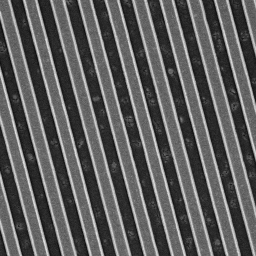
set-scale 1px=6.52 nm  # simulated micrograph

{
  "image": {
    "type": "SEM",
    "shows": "parallel lines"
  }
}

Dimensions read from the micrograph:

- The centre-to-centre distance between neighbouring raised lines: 26.4 pixels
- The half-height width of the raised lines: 0.0843 micrometres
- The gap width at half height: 89.9 nanometres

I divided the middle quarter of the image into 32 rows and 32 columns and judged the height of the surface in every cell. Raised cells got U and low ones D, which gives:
DUUUDDDDUUUDDDDUUUDDDUUUUDDDUUUU
DUUUUDDDUUUDDDDUUUDDDDUUUDDDDUUU
DUUUUDDDUUUUDDDUUUUDDDUUUDDDDUUU
DDUUUDDDDUUUDDDDUUUDDDUUUDDDDUUU
DDUUUDDDDUUUDDDDUUUDDDUUUUDDDUUU
DDUUUUDDDUUUDDDDUUUDDDDUUUDDDDUU
DDUUUUDDDUUUUDDDUUUUDDDUUUDDDDUU
DDDUUUDDDDUUUDDDDUUUDDDUUUUDDDUU
DDDUUUDDDDUUUDDDDUUUDDDUUUUDDDUU
DDDUUUUDDDUUUDDDDUUUDDDDUUUDDDDU
DDDUUUUDDDUUUUDDDUUUUDDDUUUDDDDU
DDDDUUUDDDDUUUDDDDUUUDDDUUUUDDDU
UDDDUUUUDDDUUUDDDDUUUDDDDUUUDDDU
UDDDUUUUDDDUUUDDDDUUUDDDDUUUDDDD
UDDDDUUUDDDUUUUDDDUUUUDDDUUUDDDD
UDDDDUUUDDDDUUUDDDDUUUDDDUUUUDDD
UUDDDUUUUDDDUUUDDDDUUUDDDDUUUDDD
UUDDDDUUUDDDUUUUDDDUUUDDDDUUUDDD
UUDDDDUUUDDDUUUUDDDUUUUDDDUUUUDD
UUDDDDUUUDDDDUUUDDDDUUUDDDUUUUDD
UUUDDDUUUDDDDUUUDDDDUUUDDDDUUUDD
UUUDDDDUUUDDDUUUUDDDUUUDDDDUUUDD
UUUDDDDUUUDDDDUUUDDDUUUUDDDUUUDD
UUUDDDDUUUDDDDUUUDDDDUUUDDDUUUUD
UUUUDDDUUUUDDDUUUDDDDUUUDDDDUUUD
DUUUDDDDUUUDDDUUUUDDDUUUUDDDUUUD
DUUUDDDDUUUDDDDUUUDDDUUUUDDDUUUD
DUUUUDDDUUUDDDDUUUDDDDUUUDDDUUUU
DUUUUDDDUUUUDDDUUUDDDDUUUDDDDUUU
DDUUUDDDUUUUDDDUUUUDDDUUUUDDDUUU
DDUUUDDDDUUUDDDDUUUDDDDUUUDDDUUU
DDUUUUDDDUUUDDDDUUUDDDDUUUDDDUUU